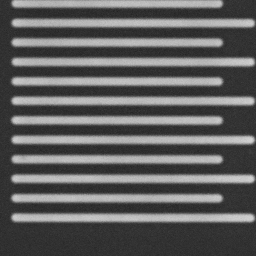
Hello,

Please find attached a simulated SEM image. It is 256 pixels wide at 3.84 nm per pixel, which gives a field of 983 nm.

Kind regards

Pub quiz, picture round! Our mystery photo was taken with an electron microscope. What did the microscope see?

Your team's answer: groups of lines, slits or small figures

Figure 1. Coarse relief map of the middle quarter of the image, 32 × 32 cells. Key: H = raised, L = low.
LLLLLLLLLLLLLLLLLLLLLLLLLLLLLLLL
LLLLLLLLLLLLLLLLLLLLLLLLLLLLLLLL
LLLLLLLLLLLLLLLLLLLLLLLLLLLLLLLL
HHHHHHHHHHHHHHHHHHHHHHHHHHHHHHHH
HHHHHHHHHHHHHHHHHHHHHHHHHHHHHHHH
LLLLLLLLLLLLLLLLLLLLLLLLLLLLLLLL
LLLLLLLLLLLLLLLLLLLLLLLLLLLLLLLL
LLLLLLLLLLLLLLLLLLLLLLLLLLLLLLLL
HHHHHHHHHHHHHHHHHHHHHHHHHHHHHHHH
HHHHHHHHHHHHHHHHHHHHHHHHHHHHHHHH
LLLLLLLLLLLLLLLLLLLLLLLLLLLLLLLL
LLLLLLLLLLLLLLLLLLLLLLLLLLLLLLLL
LLLLLLLLLLLLLLLLLLLLLLLLLLLLLLLL
HHHHHHHHHHHHHHHHHHHHHHHHHHHHHHHH
HHHHHHHHHHHHHHHHHHHHHHHHHHHHHHHH
LLLLLLLLLLLLLLLLLLLLLLLLLLLLLLLL
LLLLLLLLLLLLLLLLLLLLLLLLLLLLLLLL
LLLLLLLLLLLLLLLLLLLLLLLLLLLLLLLL
HHHHHHHHHHHHHHHHHHHHHHHHHHHHHHHH
HHHHHHHHHHHHHHHHHHHHHHHHHHHHHHHH
LLLLLLLLLLLLLLLLLLLLLLLLLLLLLLLL
LLLLLLLLLLLLLLLLLLLLLLLLLLLLLLLL
LLLLLLLLLLLLLLLLLLLLLLLLLLLLLLLL
HHHHHHHHHHHHHHHHHHHHHHHHHHHHHHHH
HHHHHHHHHHHHHHHHHHHHHHHHHHHHHHHH
LLLLLLLLLLLLLLLLLLLLLLLLLLLLLLLL
LLLLLLLLLLLLLLLLLLLLLLLLLLLLLLLL
LLLLLLLLLLLLLLLLLLLLLLLLLLLLLLLL
HHHHHHHHHHHHHHHHHHHHHHHHHHHHHHHH
HHHHHHHHHHHHHHHHHHHHHHHHHHHHHHHH
LLLLLLLLLLLLLLLLLLLLLLLLLLLLLLLL
LLLLLLLLLLLLLLLLLLLLLLLLLLLLLLLL